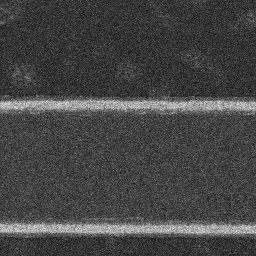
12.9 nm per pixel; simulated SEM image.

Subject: one or a few lines or trenches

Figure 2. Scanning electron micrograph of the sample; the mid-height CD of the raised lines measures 1590 nm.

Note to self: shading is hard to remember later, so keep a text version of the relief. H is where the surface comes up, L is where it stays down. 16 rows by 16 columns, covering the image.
LLLLLLLLLLLLLLLL
LLLLLLLLLLLLLLLL
LLLLLLLLLLLLLLLL
LLLLLLLLLLLLLLLL
LLLLLLLLLLLLLLLL
LLLLLLLLLLLLLLLL
LLLLLLLLLLLLLLLL
HHHHHHHHHHHHHHHH
HHHHHHHHHHHHHHHH
HHHHHHHHHHHHHHHH
HHHHHHHHHHHHHHHH
HHHHHHHHHHHHHHHH
HHHHHHHHHHHHHHHH
HHHHHHHHHHHHHHHH
LLLLLLLLLLLLLLLL
LLLLLLLLLLLLLLLL